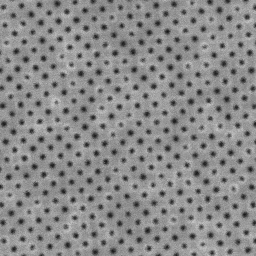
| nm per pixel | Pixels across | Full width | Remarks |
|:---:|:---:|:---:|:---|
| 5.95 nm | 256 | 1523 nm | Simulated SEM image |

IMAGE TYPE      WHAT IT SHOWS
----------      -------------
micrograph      a regular array of holes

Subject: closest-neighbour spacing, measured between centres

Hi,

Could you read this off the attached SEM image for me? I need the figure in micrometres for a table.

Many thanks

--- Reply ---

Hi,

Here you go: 0.0741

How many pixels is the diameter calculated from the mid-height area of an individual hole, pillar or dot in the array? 5.97